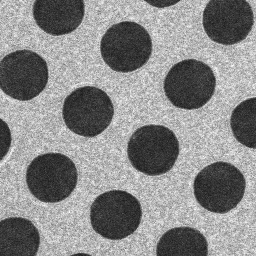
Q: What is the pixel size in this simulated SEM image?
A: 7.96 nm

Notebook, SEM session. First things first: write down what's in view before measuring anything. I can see holes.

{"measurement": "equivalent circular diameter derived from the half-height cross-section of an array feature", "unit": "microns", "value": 0.405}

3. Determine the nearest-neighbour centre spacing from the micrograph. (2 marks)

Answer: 590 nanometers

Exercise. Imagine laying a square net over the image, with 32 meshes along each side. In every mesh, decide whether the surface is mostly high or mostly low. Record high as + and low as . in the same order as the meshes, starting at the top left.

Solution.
++++.......++++++++...++++.....+
++++......+++++++++++++++.......
++++......+++++++++++++++.......
+++++.....++++....+++++++......+
+++++++++++++......+++++++.....+
+++++++++++++......+++++++++.+++
++..+++++++++......+++++++++++++
......+++++++......++++..+++++++
......++++++++...++++.....++++++
......+++++++++++++++......+++++
......++++++++++++++.......+++++
+....++++....++++++++......+++++
++..++++......+++++++.....+++++.
++++++++......+++++++++..++++...
++++++++......+++++++++++++++...
.+++++++......+++++++++++++++...
.++++++++....++++.....+++++++...
.+++++++++++++++......++++++++..
.+++++++++++++++......+++++++++.
.++++...++++++++......++++++++++
++++.....+++++++......++++...+++
+++.......++++++++...++++.....++
+++.......++++++++++++++.......+
++++.....+++++++++++++++.......+
++++.....+++.....+++++++......++
++++++++++++.....++++++++.....++
+++++++++++.......+++++++++.++++
....+++++++.......++++++++++++++
....++++++++.....+++++..++++++++
.....++++++++...++++.....+++++++
.....+++++++++++++++......++++++
.....+++++++++++++++......++++++